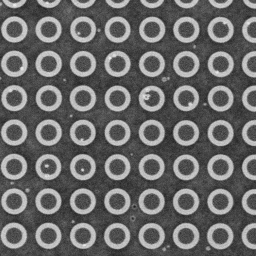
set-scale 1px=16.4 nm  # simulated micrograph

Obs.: an array of small figures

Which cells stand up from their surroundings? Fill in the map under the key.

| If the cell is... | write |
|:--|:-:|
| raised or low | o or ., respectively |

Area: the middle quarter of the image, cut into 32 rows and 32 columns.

..oooooo..oooooo...oooooo..ooooo
..oooooo...ooooo...oooooo...oooo
...oooo....oooo.....oooo....oooo
................................
................................
....o...........................
..ooooo....ooooo....oooo....oooo
..oooooo..oooooo...oooooo...oooo
..oooooo..ooooooo..oooooo...oooo
..oooooo..oooooo...oooooo...oooo
..ooooo....ooooo...oooooo...oooo
...ooo......ooo......oo......ooo
................................
................................
...oooo.....ooo.....oooo.....ooo
..ooooo....ooooo...oooooo...oooo
..oooooo..oooooo...oooooo..ooooo
..oooooo..oooooo...oooooo..ooooo
..oooooo...ooooo...oooooo...oooo
...oooo....ooooo....oooo....oooo
................................
................................
................................
...oooo....ooooo....oooo....oooo
..oooooo...ooooo...oooooo...oooo
..oooooo..oooooo...oooooo..ooooo
..oooooo..oooooo...oooooo..ooooo
..ooooo....ooooo...ooooo....oooo
...ooo......ooo.....ooo......ooo
................................
................................
...ooo......ooo......oo......ooo